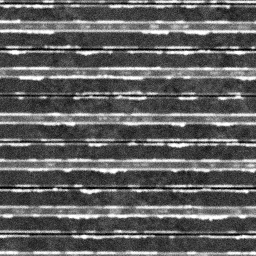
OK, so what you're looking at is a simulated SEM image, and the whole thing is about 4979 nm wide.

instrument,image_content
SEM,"parallel lines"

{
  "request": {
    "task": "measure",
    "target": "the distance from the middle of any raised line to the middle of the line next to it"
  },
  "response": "449 nm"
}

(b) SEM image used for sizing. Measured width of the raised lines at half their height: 348 nm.